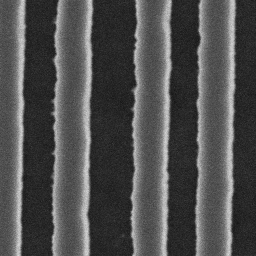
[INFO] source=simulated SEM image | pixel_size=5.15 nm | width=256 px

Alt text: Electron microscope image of lines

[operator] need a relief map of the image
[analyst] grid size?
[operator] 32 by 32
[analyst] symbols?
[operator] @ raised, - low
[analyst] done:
@@@----@@@@------@@@@----@@@@---
@@@----@@@@------@@@@----@@@@---
@@@----@@@@------@@@@----@@@@---
@@@----@@@@------@@@@----@@@@---
@@@----@@@@------@@@@----@@@@---
@@@----@@@@------@@@@----@@@@---
@@@----@@@@------@@@@----@@@@---
@@@----@@@@------@@@@----@@@@---
@@@----@@@@------@@@@----@@@@---
@@@----@@@@------@@@@----@@@@---
@@@----@@@@------@@@@----@@@@---
@@@----@@@@------@@@@----@@@@---
@@@----@@@@------@@@@----@@@@---
@@@----@@@@------@@@@----@@@@---
@@@----@@@@------@@@@----@@@@---
@@@----@@@@------@@@@----@@@@---
@@@----@@@@------@@@@----@@@@---
@@@----@@@@------@@@@----@@@@---
@@@----@@@@------@@@@----@@@@---
@@@----@@@@------@@@@----@@@@---
@@@----@@@@------@@@@----@@@@---
@@@----@@@@------@@@@----@@@@---
@@@----@@@@------@@@@----@@@@---
@@@----@@@@------@@@@----@@@@---
@@@----@@@@-----@@@@@----@@@@---
@@@----@@@@------@@@@----@@@@---
@@@----@@@@-----@@@@@---@@@@@---
@@-----@@@@-----@@@@@----@@@@---
@@@----@@@@-----@@@@@----@@@@---
@@@----@@@@-----@@@@@----@@@@---
@@@----@@@@------@@@@----@@@@---
@@-----@@@@------@@@@----@@@@---